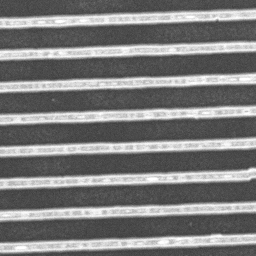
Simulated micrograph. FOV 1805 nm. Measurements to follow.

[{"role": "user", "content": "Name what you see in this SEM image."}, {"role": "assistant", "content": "parallel lines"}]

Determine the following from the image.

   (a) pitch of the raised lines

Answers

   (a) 226 nanometres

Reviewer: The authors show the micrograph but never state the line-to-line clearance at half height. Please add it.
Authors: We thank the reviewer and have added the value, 158 nm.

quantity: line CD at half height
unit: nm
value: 65.2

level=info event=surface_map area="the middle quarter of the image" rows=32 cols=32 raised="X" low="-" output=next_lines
--------------------------------
--------------------------------
--------------------------------
--------------------XX----XXXXXX
XXXXXXXXXXXXXXXXXXXXXXXXXXXXXXXX
XXXXXXXXXXXXXXXXXXXXXXX-----X---
--------------------------------
--------------------------------
--------------------------------
--------------------------------
--------------------------------
-----------------------XXX-XX-XX
XXXXXXXXXXXXXXXXXXXXXXXXXXXXXXXX
XXXXXXXXXXXXXXXXXXXXXXXXXXX-----
-XX-----------------------------
--------------------------------
--------------------------------
--------------------------------
--------------------------------
---------------------------XXXXX
XXXXXXXXXXXXXXXXXXXXXXXXXXXXXXXX
XXXXXXXXXXXXXXXXXXXXXXXXXXXXXX--
X-------------------------------
--------------------------------
--------------------------------
--------------------------------
--------------------------------
------------------------X-XXXXXX
XXXXXXXXXXXXXXXXXXXXXXXXXXXXXXXX
XXXXXXXXXXXXXXXXXXXXXXXXXX-XXX--
--------------------------------
--------------------------------